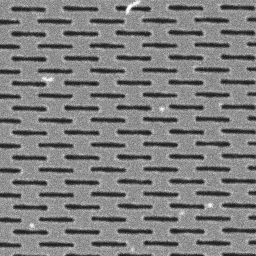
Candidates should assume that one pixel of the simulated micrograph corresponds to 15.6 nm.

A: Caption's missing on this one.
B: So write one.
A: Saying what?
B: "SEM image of a regular array of holes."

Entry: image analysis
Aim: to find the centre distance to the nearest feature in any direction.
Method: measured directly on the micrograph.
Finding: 386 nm